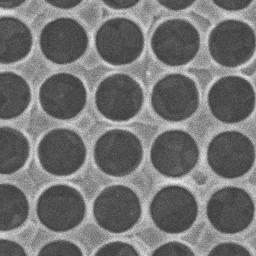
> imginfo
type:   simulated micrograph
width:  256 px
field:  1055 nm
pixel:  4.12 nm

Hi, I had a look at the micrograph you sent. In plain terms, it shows a regular array of holes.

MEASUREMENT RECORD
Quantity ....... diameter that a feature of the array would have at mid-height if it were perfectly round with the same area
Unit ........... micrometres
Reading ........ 0.2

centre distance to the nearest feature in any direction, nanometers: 230